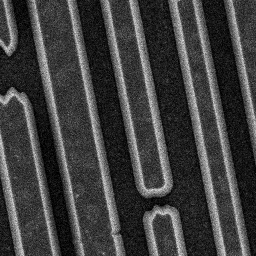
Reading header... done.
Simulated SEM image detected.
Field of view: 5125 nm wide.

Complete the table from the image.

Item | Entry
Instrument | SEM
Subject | one or a few lines or trenches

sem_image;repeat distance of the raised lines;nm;1290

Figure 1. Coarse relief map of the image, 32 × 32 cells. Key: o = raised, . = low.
o...ooooo....oooo....oooo...oooo
o...ooooo....oooo.....ooo....ooo
oo..oooooo...oooo.....ooo....ooo
oo..oooooo....oooo....ooo....ooo
oo...ooooo....oooo....oooo...ooo
oo...ooooo....oooo....oooo...ooo
.....ooooo....oooo.....ooo....oo
.....oooooo...oooo.....ooo....oo
.....oooooo...ooooo....oooo...oo
......ooooo....oooo....oooo...oo
......ooooo....oooo....oooo...oo
.o....ooooo....oooo.....ooo....o
ooo...oooooo...oooo.....ooo....o
oooo..oooooo...oooo.....ooo....o
oooo...ooooo....oooo....oooo...o
oooo...ooooo....oooo....oooo...o
oooo...ooooo....oooo.....ooo....
ooooo..oooooo...oooo.....ooo....
ooooo..oooooo...oooo.....ooo....
ooooo...ooooo....oooo....oooo...
ooooo...ooooo....oooo....oooo...
ooooo...ooooo....oooo....oooo...
ooooo...ooooo....oooo.....ooo...
.ooooo..oooooo...oooo.....ooo...
.ooooo..oooooo............oooo..
.ooooo...ooooo............oooo..
.ooooo...ooooo.....ooo.....ooo..
.ooooo...ooooo....oooo.....ooo..
..ooooo..oooooo...oooo.....ooo..
..ooooo..oooooo....oooo....oooo.
..ooooo...ooooo....oooo....oooo.
..ooooo...ooooo....oooo....oooo.